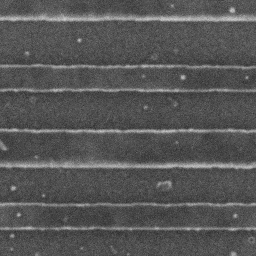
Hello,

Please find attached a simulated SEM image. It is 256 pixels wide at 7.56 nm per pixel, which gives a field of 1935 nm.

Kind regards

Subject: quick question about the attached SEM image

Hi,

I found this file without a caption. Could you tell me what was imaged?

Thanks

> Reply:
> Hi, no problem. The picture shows lines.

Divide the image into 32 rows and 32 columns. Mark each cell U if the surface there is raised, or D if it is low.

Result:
UUUUUUUUUUUUUUUUUUUUUUUUUUUUUUUU
UUUUUUUUUUUUUUUUUUUUUUUUUUUUUUUU
DDDDDDDDDDDDDDDDDDDDDDDDDDDDDDDD
DDDDDDDDDDDDDDDDDDDDDDDDDDDDDDDD
DDDDDDDDDDDDDDDDDDDDDDDDDDDDDDDD
DDDDDDDDDDDDDDDDDDDDDDDDDDDDDDDD
DDDDDDDDDDDDDDDDDDDDDDDDDDDDDDDD
DDDDDDDDDDDDDDDDDDDDDDDDDDDDDDDD
UUUUUUUUUUUUUUUUUUUUUUUUUUUUUUUU
UUUUUUUUUUUUUUUUUUUUUUUUUUUUUUUU
UUUUUUUUUUUUUUUUUUUUUUUUUUUUUUUU
DDDDDDDDDDDDDDDDDDDDDDDDDDDDDDDD
DDDDDDDDDDDDDDDDDDDDDDDDDDDDDDDD
DDDDDDDDDDDDDDDDDDDDDDDDDDDDDDDD
DDDDDDDDDDDDDDDDDDDDDDDDDDDDDDDD
DDDDDDDDDDDDDDDDDDDDDDDDDDDDDDDD
UUUUUUUUUUUUUUUUUUUUUUUUUUUUUUUU
UUUUUUUUUUUUUUUUUUUUUUUUUUUUUUUU
UUUUUUUUUUUUUUUUUUUUUUUUUUUUUUUU
UUUUUUUUUUUUUUUUUUUUUUUUUUUUUUUU
UUUUUUUUUUUUUUUUUUUUUUUUUUUUUUUU
DDDDDDDDDDDDDDDDDDDDDDDDDDDDDDDD
DDDDDDDDDDDDDDDDDDDDDDDDDDDDDDDD
DDDDDDDDDDDDDDDDDDDDDDDDDDDDDDDD
DDDDDDDDDDDDDDDDDDDDDDDDDDDDDDDD
UUUUUUDDDDDDUUDDUUUUDDUUUUUDUUUU
UUUUUUUUUUUUUUUUUUUUUUUUUUUUUUUU
UUUUUUUUUUUUUUUUUUUUUUUUUUUUUUUU
UUUUUUUUUUUUUUUUUUUUUUUUUUUUUUUU
DDDDDDDDDDDDDDDDDDDDDDDDDDDDDDDD
DDDDDDDDDDDDDDDDDDDDDDDDDDDDDDDD
DDDDDDDDDDDDDDDDDDDDDDDDDDDDDDDD